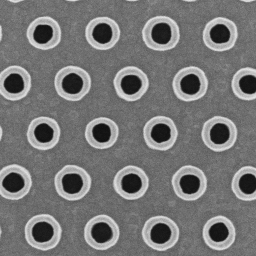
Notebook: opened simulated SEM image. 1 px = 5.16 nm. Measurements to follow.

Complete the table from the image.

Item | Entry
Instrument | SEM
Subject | a regular array of ring-shaped raised bodies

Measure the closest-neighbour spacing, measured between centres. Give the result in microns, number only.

0.296